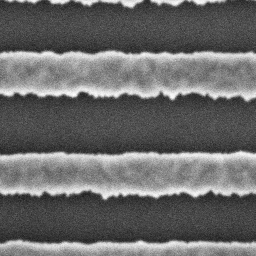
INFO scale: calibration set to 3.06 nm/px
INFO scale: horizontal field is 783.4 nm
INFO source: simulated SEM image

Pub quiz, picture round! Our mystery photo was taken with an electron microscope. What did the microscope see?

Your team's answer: lines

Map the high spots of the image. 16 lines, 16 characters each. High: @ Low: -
----------------
----------------
----------------
@@@@@@@@@@@@@@@@
@@@@@@@@@@@@@@@@
@@@@@@@@@@@@@@@@
----------------
----------------
----------------
----------------
@@@@@@@@@@@@@@@@
@@@@@@@@@@@@@@@@
----------------
----------------
----------------
@@@@@@@@@@@@@@@@